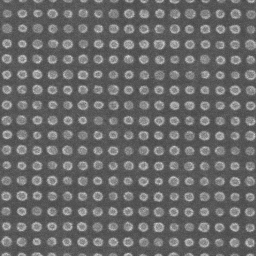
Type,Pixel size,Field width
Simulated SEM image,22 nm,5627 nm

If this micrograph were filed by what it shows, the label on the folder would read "a regular array of raised bodies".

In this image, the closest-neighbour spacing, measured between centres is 326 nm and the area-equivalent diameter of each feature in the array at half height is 184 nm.